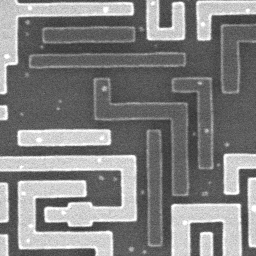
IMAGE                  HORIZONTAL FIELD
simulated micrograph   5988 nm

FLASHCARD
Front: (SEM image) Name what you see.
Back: wiring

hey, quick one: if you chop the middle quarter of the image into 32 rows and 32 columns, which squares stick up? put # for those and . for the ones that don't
##############.###..............
................................
................................
................................
........###................#####
........###................#####
........###................#####
........###.....................
........###.....................
........####....................
........#######################.
........#######################.
........#######################.
........#######################.
...........................####.
...........................####.
...........................####.
###########..........###...####.
###########..........###...####.
###########..........###...####.
.....................###...####.
.....................###...####.
.....................###...####.
##################...###...####.
##################...###...####.
##################...###...####.
##............####...###...####.
..............####...###...####.
..............####...###...####.
#####.........####...###...####.
#####.........####...###...####.
#####..........###...###...####.